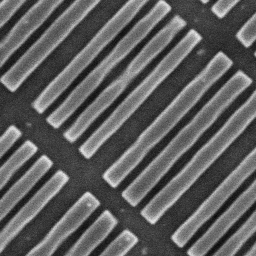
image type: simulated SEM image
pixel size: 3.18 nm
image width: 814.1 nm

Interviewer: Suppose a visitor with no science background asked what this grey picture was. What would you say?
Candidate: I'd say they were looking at groups of lines, slits or small figures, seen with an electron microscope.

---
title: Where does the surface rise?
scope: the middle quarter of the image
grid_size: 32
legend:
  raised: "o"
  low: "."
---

.ooooo...ooo....oooo....oooo....
ooooo...ooo.....ooo....oooo.....
oooo..oooo.....ooo....oooo......
ooo..ooooo....ooo....oooo.......
oo..ooooo....ooo....oooo........
o..ooooo....ooo....oooo........o
..ooooo...ooooo...oooo........oo
..oooo...ooooo...oooo........ooo
.oooo...ooooo...oooo........oooo
ooooo..ooooo...ooooo.......ooooo
oooo..ooooo...ooooo.......oooooo
ooo..ooooo...ooooo.......oooooo.
oo..ooooo...ooooo.......oooooo..
o...oooo...ooooo.......oooooo...
...oooo...ooooo........ooooo....
..oooo...ooooo........ooooo....o
.oooo...ooooo........ooooo...ooo
.ooo...ooooo........ooooo...oooo
.oo...ooooo........ooooo....oooo
......oooo........ooooo....ooooo
.....oooo.........oooo....oooooo
....oooo........ooooo....ooooo..
.....oo........ooooo....ooooo...
..............ooooo....ooooo....
.............oooooo...ooooo.....
............oooooo...oooooo....o
...........oooooo...oooooo....oo
..........oooooo...oooooo....ooo
o.........ooooo...oooooo....oooo
...........ooo...oooooo...oooooo
............o...oooooo....ooooo.
...............oooooo...oooooo..